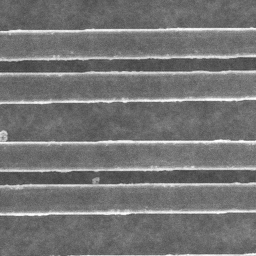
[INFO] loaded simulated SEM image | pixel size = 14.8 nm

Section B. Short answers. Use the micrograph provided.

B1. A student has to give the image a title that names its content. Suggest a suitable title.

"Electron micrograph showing lines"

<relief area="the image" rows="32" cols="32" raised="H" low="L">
LLLLLLLLLLLLLLLLLLLLLLLLLLLLLLLL
LLLLLLLLLLLLLLLLLLLLLLLLLLLLLLLL
LLLLLLLLLLLLLLLLLLLLLLLLLLLLLLLL
LLLLLLLLLLLLLLLLLLLLLLLLLLLLLLLL
HHHHHHHHHHHHHHHHHHHHHHHHHHHHHHHH
HHHHHHHHHHHHHHHHHHHHHHHHHHHHHHHH
HHHHHHHHHHHHHHHHHHHHHHHHHHHHHHHH
HHLLLLLLLLLLLLLLLLLLLLLLLLLLLLLL
LLLLLLLLLLLLLLLLLLLLLLLLLLLLLLLL
HHHHHHHHHHHHHHHHHHHHHHHHHHHHHHHH
HHHHHHHHHHHHHHHHHHHHHHHHHHHHHHHH
HHHHHHHHHHHHHHHHHHHHHHHHHHHHHHHH
HHHHHHHHHHHHHHHHHHHHHLLLLLLLLLLL
LLLLLLLLLLLLLLLLLLLLLLLLLLLLLLLL
LLLLLLLLLLLLLLLLLLLLLLLLLLLLLLLL
LLLLLLLLLLLLLLLLLLLLLLLLLLLLLLLL
LLLLLLLLLLLLLLLLLLLLLLLLLLLLLLLL
LLLLLLLLLLLLLLLLLLLLLLLLLLLLLLLL
HHHHHHHHHHHHHHHHHHHHHHHHHHHHHHHH
HHHHHHHHHHHHHHHHHHHHHHHHHHHHHHHH
HHHHHHHHHHHHHHHHHHHHHHHHHHHHHHHH
LLLLLLLLLLLLLLLLLLLLLLLLLLLLLLLL
LLLLLLLLLLLLLLLLLLLLLLLLLLLLLLLL
HHHHHHHHHHHHHHHHHHHHHHHHHHHHHHHH
HHHHHHHHHHHHHHHHHHHHHHHHHHHHHHHH
HHHHHHHHHHHHHHHHHHHHHHHHHHHHHHHH
HHHHHHHHHHHHHHHHHHHHHHHHHHHHLLLL
LLLLLLLLLLLLLLLLLLLLLLLLLLLLLLLL
LLLLLLLLLLLLLLLLLLLLLLLLLLLLLLLL
LLLLLLLLLLLLLLLLLLLLLLLLLLLLLLLL
LLLLLLLLLLLLLLLLLLLLLLLLLLLLLLLL
LLLLLLLLLLLLLLLLLLLLLLLLLLLLLLLL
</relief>